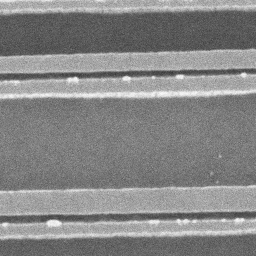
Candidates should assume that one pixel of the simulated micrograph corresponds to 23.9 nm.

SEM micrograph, lines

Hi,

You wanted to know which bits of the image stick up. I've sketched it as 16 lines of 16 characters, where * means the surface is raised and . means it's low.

************....
................
................
...*************
****************
****************
................
................
................
................
................
................
****************
****************
************....
................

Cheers